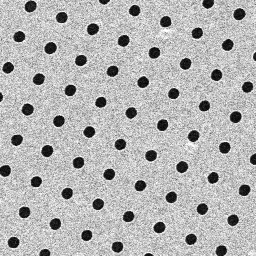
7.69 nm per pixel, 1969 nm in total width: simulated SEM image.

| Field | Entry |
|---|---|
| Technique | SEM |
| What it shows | a regular array of holes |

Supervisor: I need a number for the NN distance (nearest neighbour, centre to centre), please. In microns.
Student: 0.248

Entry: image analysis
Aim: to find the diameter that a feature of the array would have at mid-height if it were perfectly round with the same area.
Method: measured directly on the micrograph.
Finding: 90.6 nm